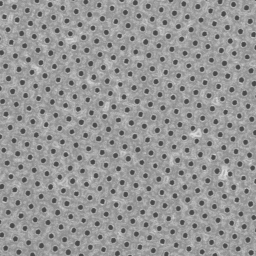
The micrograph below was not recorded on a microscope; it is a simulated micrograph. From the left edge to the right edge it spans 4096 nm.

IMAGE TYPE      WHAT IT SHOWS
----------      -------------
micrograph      a regular array of holes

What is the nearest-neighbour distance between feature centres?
210 nm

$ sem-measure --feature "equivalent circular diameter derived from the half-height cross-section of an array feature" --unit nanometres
84.7